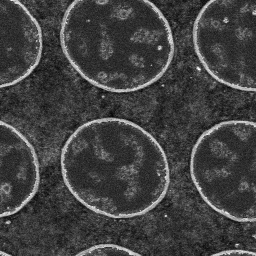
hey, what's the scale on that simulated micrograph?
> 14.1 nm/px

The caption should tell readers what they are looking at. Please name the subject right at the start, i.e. raised bodies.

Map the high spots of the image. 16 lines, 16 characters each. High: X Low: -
X---XXXXXX---XXX
XX--XXXXXX--XXXX
XXX-XXXXXXX-XXXX
XX--XXXXXXX-XXXX
XX---XXXXX---XXX
-------XX------X
----------------
----------------
X----XXXX----XXX
XX--XXXXXX--XXXX
XX--XXXXXX--XXXX
XX--XXXXXX--XXXX
XX---XXXXX---XXX
--------------XX
----------------
------X---------